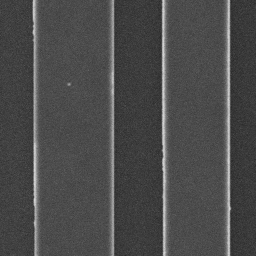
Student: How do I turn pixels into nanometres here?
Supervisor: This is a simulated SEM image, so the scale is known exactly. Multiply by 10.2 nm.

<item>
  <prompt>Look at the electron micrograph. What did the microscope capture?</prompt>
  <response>lines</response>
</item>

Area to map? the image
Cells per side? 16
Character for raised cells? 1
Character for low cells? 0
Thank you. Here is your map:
0011111000111100
0011111000111100
0011111000111100
0011111000111100
0011111000111100
0011111000111100
0011111000111100
0011111000111100
0011111000111100
0011111000111100
0011111000111100
0011111000111100
0011111000111100
0011111000111100
0011111000111100
0011111000111100